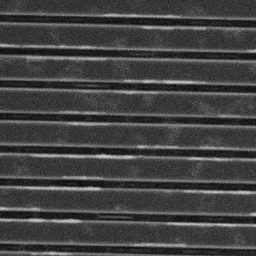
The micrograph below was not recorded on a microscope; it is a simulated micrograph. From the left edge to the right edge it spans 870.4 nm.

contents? parallel lines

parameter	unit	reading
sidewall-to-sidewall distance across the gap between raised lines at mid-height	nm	28.5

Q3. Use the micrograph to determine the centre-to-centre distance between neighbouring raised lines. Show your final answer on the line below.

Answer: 111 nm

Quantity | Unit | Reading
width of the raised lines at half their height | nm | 82.4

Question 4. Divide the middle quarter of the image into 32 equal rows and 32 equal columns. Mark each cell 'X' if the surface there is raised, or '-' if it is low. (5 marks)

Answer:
XXXXXXXXXXXXXXXXXXXXXXXXXXXXXXXX
XXXXXXXXXXXXXXXXXXXXXXXXXXXXXXXX
XXXXXXXXXXXXXXXXXXXXXXXXXXXXXXXX
XXXXXXXXXXXXXXXXXXXXXXXXXXXXXXXX
---------------XXXXXXXXXXXXXXXXX
--------------------------------
--------------------------------
XXXXXXXXXXXXXXXXXXXXXXXXXXXXXXXX
XXXXXXXXXXXXXXXXXXXXXXXXXXXXXXXX
XXXXXXXXXXXXXXXXXXXXXXXXXXXXXXXX
XXXXXXXXXXXXXXXXXXXXXXXXXXXXXXXX
XXXXXXXXXXXXXXXXXXXXXXXXXXXXXXXX
-----XXXXXXXXXXXXXXXXXXXXXXXXXXX
--------------------------------
--------------------------------
XXXXXXXXXXXXXXXXXXXXXXXXXXXXXXXX
XXXXXXXXXXXXXXXXXXXXXXXXXXXXXXXX
XXXXXXXXXXXXXXXXXXXXXXXXXXXXXXXX
XXXXXXXXXXXXXXXXXXXXXXXXXXXXXXXX
XXXXXXXXXXXXXXXXXXXXXXXXXXXXXXXX
-------XXXXXXXXXXXXXXXXXXXXXXXXX
--------------------------------
--------------------------------
XXXXXXXXXXXXXXXXXXXXXXXXXXXXX---
XXXXXXXXXXXXXXXXXXXXXXXXXXXXXXXX
XXXXXXXXXXXXXXXXXXXXXXXXXXXXXXXX
XXXXXXXXXXXXXXXXXXXXXXXXXXXXXXXX
XXXXXXXXXXXXXXXXXXXXXXXXXXXXXXXX
XXXXXXXXXXXXXXXXXXXXXXXXXXXXXXXX
--------------------------------
--------------------------------
XXXXXXXXXXXXXXXXXXXXXX----------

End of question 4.